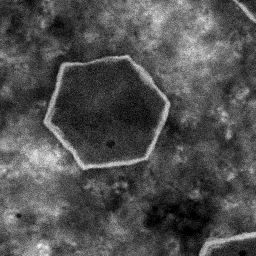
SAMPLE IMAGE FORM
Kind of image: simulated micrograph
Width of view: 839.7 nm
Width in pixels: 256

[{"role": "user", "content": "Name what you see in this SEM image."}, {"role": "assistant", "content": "raised bodies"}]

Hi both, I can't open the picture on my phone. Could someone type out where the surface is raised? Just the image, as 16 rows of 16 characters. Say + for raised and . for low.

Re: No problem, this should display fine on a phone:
...............+
................
................
................
....+++++.......
....++++++......
...+++++++......
...+++++++......
....++++++......
.....++++.......
................
................
................
................
................
.............+++